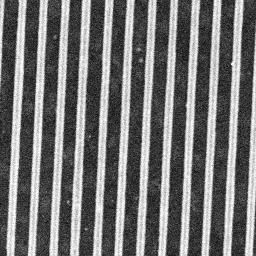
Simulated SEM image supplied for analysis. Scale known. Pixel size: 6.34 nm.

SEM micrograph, parallel lines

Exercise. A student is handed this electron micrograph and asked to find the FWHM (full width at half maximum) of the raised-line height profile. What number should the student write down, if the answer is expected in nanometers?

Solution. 37.2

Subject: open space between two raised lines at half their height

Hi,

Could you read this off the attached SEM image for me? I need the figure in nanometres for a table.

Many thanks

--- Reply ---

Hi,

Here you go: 100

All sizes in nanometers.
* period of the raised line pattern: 138